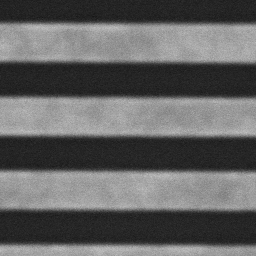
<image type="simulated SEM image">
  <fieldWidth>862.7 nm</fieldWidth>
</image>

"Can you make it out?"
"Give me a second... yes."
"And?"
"wiring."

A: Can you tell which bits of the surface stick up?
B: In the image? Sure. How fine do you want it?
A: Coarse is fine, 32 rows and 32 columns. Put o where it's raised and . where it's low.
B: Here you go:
................................
................................
................................
oooooooooooooooooooooooooooooooo
oooooooooooooooooooooooooooooooo
oooooooooooooooooooooooooooooooo
oooooooooooooooooooooooooooooooo
oooooooooooooooooooooooooooooooo
................................
................................
................................
................................
oooooooooooooooooooooooooooooooo
oooooooooooooooooooooooooooooooo
oooooooooooooooooooooooooooooooo
oooooooooooooooooooooooooooooooo
oooooooooooooooooooooooooooooooo
................................
................................
................................
................................
................................
oooooooooooooooooooooooooooooooo
oooooooooooooooooooooooooooooooo
oooooooooooooooooooooooooooooooo
oooooooooooooooooooooooooooooooo
................................
................................
................................
................................
................................
oooooooooooooooooooooooooooooooo